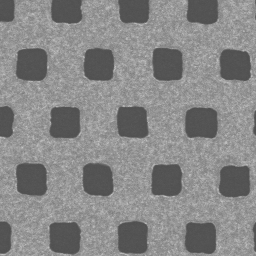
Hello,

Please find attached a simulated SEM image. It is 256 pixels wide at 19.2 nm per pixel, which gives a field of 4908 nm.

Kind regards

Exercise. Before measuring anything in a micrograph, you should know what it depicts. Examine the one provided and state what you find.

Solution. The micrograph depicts a regular array of holes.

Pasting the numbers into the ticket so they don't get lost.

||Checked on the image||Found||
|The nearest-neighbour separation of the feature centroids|66.5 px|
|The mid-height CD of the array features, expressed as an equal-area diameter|648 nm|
